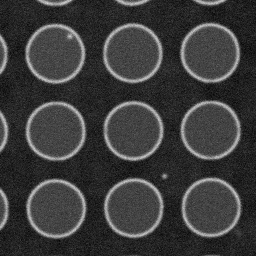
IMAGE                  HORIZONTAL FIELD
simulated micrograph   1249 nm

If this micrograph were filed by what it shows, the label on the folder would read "an array of small figures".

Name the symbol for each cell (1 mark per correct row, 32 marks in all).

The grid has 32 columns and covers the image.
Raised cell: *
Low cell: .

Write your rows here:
......**.......**.........*.....
................................
................................
.....****......***.......***....
....******....*****....******...
*...******...*******...*******..
*..*******...*******...*******..
*..*******...*******...*******..
....******...*******...******...
.....****.....*****.....****....
................................
................................
................................
.....****......****.....*****...
....******...*******...******...
*...******...*******...*******..
*..********..*******...*******..
*...******...*******...*******..
....******....******...******...
.....****......***.......***....
................................
................................
......**........**.......***....
.....****.....*****.....*****...
*...******...*******...*******..
*..********..*******...*******..
*..********..*******...*******..
*...******...*******...*******..
....******....*****.....*****...
......**........**........*.....
................................
................................